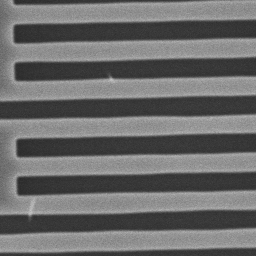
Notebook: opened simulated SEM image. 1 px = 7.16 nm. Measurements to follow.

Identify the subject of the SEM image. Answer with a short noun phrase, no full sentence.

groups of lines, slits or small figures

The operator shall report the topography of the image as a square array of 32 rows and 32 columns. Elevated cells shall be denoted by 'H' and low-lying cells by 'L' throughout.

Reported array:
HHLLLLLLLLLLHHHHHHHHHHHHHHHHHHHH
HHHHHHHHHHHHHHHHHHHHHHHHHHHHHHHH
HHHHHHHHHHHHHHHHHHHHHHLLLLLLLLLL
HHLLLLLLLLLLLLLLLLLLLLLLLLLLLLLL
HHLLLLLLLLLLLLLLLLLLLLLLLLLLLLLL
HHLLHHHHHHHHHHHHHHHHHHHHHHHHHHHH
HHHHHHHHHHHHHHHHHHHHHHHHHHHHHHHH
HHHHHHHHHHHHHHHLLLLLLLLLLLLLLLLL
HHLLLLLLLLLLLLLLLLLLLLLLLLLLLLLL
HHLLLLLLLLLLLLLLLLLLLLLLLLLLLLLL
HHHHHHHHHHHHHHHHHHHHHHHHHHHHHHHH
HHHHHHHHHHHHHHHHHHHHHHHHHHHHHHHH
HHHHHLLLLLLLLLLLLLLLLLLLLLLLLLLL
LLLLLLLLLLLLLLLLLLLLLLLLLLLLLLLL
LLLLLLLLLLLLLLLLLLLLLLLLLLLLLHHH
HHHHHHHHHHHHHHHHHHHHHHHHHHHHHHHH
HHHHHHHHHHHHHHHHHHHHHHHHHHHHHHHH
HHLLLLLLLLLLLLLLLLLLLLLLLLLLLLLL
HHLLLLLLLLLLLLLLLLLLLLLLLLLLLLLL
HHLLLLLLLLLLLHHHHHHHHHHHHHHHHHHH
HHHHHHHHHHHHHHHHHHHHHHHHHHHHHHHH
HHHHHHHHHHHHHHHHHHHHHLLLLLLLLLLL
HHLLLLLLLLLLLLLLLLLLLLLLLLLLLLLL
HHLLLLLLLLLLLLLLLLLLLLLLLLLLLLLL
HHHLHHHHHHHHHHHHHHHHHHHHHHHHHHHH
HHHHHHHHHHHHHHHHHHHHHHHHHHHHHHHH
HHHHHHHHHHHHHHHHHLLLLLLLLLLLLLLL
LLLLLLLLLLLLLLLLLLLLLLLLLLLLLLLL
LLLLLLLLLLLLLLLLLLLLLLLLLLLLLLLL
HHHHHHHHHHHHHHHHHHHHHHHHHHHHHHHH
HHHHHHHHHHHHHHHHHHHHHHHHHHHHHHHH
HLHHHHHLLLLLLLLLLLLLLLLLLLLLLLLL